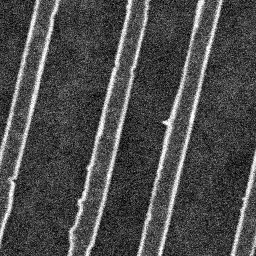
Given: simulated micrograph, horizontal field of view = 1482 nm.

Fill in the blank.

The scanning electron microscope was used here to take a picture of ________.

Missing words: one or a few lines or trenches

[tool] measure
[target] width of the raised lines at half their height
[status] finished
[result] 115 nanometers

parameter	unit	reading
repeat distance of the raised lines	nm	436